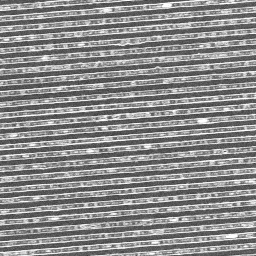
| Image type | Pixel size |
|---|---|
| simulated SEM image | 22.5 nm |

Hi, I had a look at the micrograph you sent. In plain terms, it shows parallel lines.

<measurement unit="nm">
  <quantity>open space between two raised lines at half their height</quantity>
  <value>123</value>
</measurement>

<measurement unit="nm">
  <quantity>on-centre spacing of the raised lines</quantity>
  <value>240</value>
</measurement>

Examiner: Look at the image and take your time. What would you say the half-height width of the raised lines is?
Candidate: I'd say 120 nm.